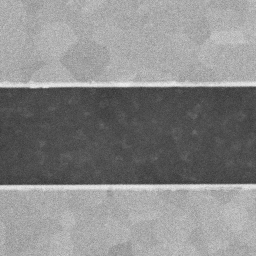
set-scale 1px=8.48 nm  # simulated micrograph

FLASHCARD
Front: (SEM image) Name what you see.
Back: one or a few lines or trenches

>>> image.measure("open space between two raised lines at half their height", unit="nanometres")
861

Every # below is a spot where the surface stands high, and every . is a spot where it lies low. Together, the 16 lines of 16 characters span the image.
################
################
################
################
################
................
................
................
................
................
................
................
################
################
################
################